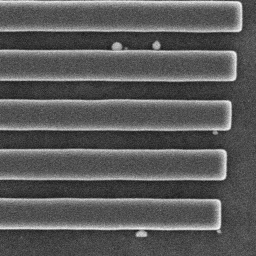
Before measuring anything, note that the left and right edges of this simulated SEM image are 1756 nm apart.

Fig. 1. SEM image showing groups of lines, slits or small figures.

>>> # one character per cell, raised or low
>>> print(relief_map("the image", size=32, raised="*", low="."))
******************************..
******************************..
******************************..
******************************..
................................
................................
***************************.....
*****************************...
*****************************...
*****************************...
................................
................................
................................
*****************************...
*****************************...
*****************************...
................................
................................
................................
****************************....
****************************....
****************************....
................................
................................
................................
****************************....
****************************....
****************************....
***************************.....
................................
................................
................................